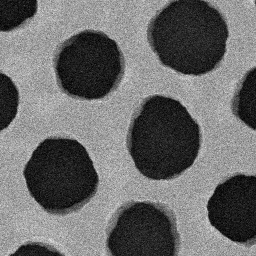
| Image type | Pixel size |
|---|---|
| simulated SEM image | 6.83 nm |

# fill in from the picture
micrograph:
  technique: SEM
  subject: holes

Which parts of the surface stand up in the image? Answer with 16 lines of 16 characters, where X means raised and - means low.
--XXXXXXXX---XXX
-XXXXXXXX-----XX
XXXX---XX-----XX
XXXX----XX----XX
XXXX----XXX--XXX
-XXX---XXXXXXXX-
-XXXXXXXX--XXXX-
-XXXXXXX----XXX-
XXXXXXXX----XXXX
XX---XXX----XXXX
XX----XXX---XXXX
XX----XXXXXXXX--
XX----XXXXXXX---
XXXXXXX----XX---
XXXXXXX----XXX--
X--XXXX----XXXXX